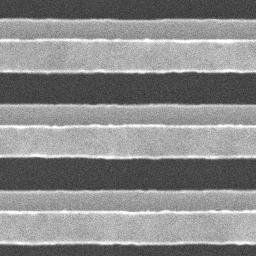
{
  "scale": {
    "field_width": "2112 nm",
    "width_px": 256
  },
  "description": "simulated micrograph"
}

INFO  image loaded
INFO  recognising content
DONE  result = lines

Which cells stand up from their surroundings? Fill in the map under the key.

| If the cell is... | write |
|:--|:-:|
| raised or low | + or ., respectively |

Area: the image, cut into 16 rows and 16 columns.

................
++++++++++++++++
++++++++++++++++
++++++++++++++++
.+++.+.++++....+
................
................
++++++++++++++++
++++++++++++++++
++++++++++++++++
................
................
++++++++++++++++
++++++++++++++++
++++++++++++++++
................